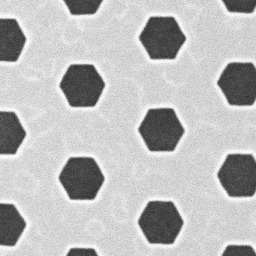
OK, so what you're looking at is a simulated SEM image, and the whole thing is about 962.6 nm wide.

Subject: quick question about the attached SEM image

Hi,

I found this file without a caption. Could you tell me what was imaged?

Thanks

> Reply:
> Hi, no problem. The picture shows holes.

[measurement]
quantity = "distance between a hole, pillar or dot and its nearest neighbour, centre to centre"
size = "340 nanometres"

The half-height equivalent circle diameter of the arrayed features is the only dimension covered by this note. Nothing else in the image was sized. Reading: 44.8 px